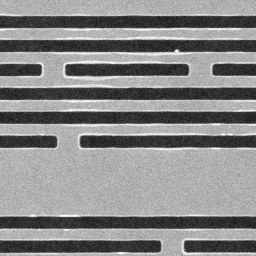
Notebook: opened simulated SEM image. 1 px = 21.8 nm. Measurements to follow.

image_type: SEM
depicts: groups of lines, slits or small figures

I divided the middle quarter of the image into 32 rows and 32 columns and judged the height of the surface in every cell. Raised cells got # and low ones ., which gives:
...............................#
...............................#
...............................#
####......######################
################################
#####....#######################
................................
................................
................................
################################
################################
##.....#########################
................................
................................
................................
################################
################################
#####......#########............
####............................
####............................
####............................
################################
################################
################################
################################
################################
################################
################################
################################
################################
################################
################################